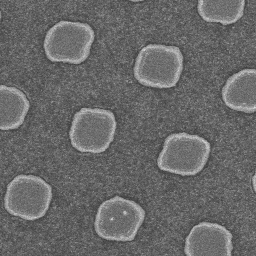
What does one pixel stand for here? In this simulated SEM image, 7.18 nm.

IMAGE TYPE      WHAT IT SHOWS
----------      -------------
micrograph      raised bodies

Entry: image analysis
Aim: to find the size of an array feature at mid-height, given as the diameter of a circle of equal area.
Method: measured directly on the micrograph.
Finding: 0.319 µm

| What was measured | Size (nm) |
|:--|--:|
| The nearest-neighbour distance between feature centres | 659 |